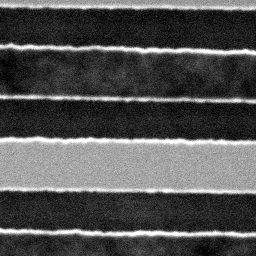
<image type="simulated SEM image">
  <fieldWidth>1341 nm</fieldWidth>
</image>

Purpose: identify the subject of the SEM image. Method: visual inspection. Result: lines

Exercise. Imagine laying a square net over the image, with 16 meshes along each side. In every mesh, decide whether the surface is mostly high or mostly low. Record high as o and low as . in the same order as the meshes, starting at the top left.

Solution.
.....o..oooooooo
................
................
oooooooooooooooo
oooooooooooooooo
oooooooooooooooo
................
................
................
oooooooooooooooo
oooooooooooooooo
oooooooooooooooo
................
................
ooooo...........
oooooooooooooooo